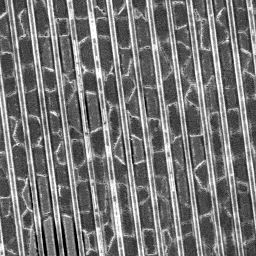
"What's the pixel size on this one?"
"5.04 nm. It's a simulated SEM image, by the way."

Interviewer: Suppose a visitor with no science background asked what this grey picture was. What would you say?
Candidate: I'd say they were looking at parallel lines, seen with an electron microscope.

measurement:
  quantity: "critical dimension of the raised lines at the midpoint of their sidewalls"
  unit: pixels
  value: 4.96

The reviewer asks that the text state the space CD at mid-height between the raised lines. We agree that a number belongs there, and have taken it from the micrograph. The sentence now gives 75.7 nanometres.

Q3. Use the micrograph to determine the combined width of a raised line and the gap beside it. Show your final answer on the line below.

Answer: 99.7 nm